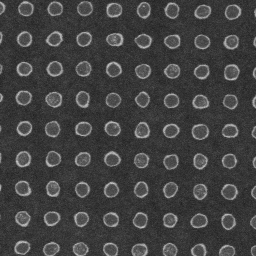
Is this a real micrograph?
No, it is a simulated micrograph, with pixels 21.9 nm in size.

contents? a regular array of raised bodies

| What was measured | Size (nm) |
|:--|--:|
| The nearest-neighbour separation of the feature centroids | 637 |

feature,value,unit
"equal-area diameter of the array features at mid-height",319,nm